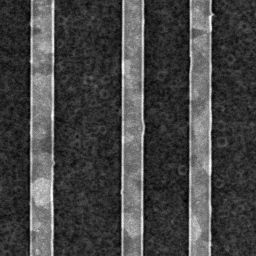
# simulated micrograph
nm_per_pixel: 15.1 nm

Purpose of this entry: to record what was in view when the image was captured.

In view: one or a few lines or trenches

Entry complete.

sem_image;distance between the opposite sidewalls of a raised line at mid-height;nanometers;305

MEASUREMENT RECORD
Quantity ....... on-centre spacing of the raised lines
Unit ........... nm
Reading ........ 1190